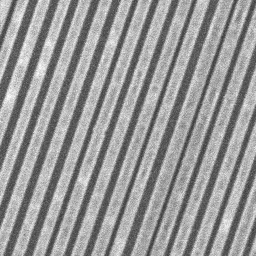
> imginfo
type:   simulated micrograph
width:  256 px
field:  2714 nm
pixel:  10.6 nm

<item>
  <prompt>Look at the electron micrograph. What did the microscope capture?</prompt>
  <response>parallel lines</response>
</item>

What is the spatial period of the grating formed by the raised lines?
200 nm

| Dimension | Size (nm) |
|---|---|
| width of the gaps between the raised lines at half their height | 88.9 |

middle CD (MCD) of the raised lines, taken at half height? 0.119 microns